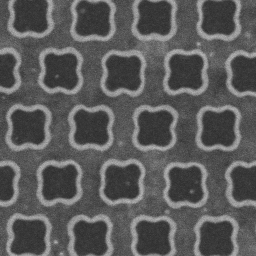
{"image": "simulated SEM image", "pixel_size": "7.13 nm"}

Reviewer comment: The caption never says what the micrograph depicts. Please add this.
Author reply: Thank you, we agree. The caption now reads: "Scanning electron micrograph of a regular array of raised bodies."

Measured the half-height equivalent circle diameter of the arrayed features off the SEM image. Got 313 nm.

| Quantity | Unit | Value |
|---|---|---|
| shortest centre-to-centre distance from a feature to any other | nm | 446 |